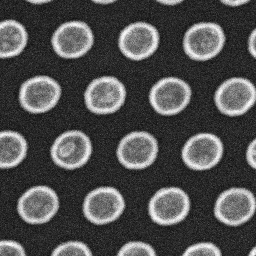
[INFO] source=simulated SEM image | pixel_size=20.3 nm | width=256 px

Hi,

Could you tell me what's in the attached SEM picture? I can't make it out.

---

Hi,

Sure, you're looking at a regular array of raised bodies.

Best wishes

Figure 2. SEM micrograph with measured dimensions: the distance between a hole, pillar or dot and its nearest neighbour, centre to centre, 1300 nm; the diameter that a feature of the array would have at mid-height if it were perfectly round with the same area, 730 nanometers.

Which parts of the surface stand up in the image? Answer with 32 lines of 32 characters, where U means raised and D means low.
DDDDDDDDDDDDDDDDDDDDDDDDDDDDDUDD
DDDDDDDDDDDDDDDDDDDDDDDDDDDDDDDD
DDDDDDDDDDDDDDDDDDDDDDDDDDDDDDDD
UUUDDDDDUUUDDDDDUUUDDDDDUUUDDDDD
UUUDDDDUUUUDDDDUUUUUDDDUUUUUDDDU
UUUDDDDUUUUDDDDUUUUUDDDUUUUUDDDU
UUDDDDDUUUUDDDDDUUUDDDDDUUUDDDDU
DDDDDDDDDDDDDDDDDDDDDDDDDDDDDDDD
DDDDDDDDDDDDDDDDDDDDDDDDDDDDDDDD
DDDDDDDDDDDDDDDDDDDDDDDDDDDDDDDD
DDDUUUUDDDDDUUUDDDDDUUUDDDDDUUUD
DDDUUUUDDDDUUUUDDDDUUUUUDDDUUUUU
DDDUUUUDDDDUUUUDDDDUUUUDDDDUUUUU
DDDUUUDDDDDUUUUDDDDUUUUDDDDDUUUD
DDDDDDDDDDDDDDDDDDDDDDDDDDDDDDDD
DDDDDDDDDDDDDDDDDDDDDDDDDDDDDDDD
DDDDDDDDDDDDDDDDDDDDDDDDDDDDDDDD
UUUDDDDUUUUDDDDUUUUDDDDDUUUDDDDD
UUUDDDDUUUUDDDDUUUUDDDDUUUUUDDDU
UUUDDDDUUUUDDDDUUUUDDDDUUUUDDDDU
UUDDDDDUUUDDDDDDUUUDDDDDUUUDDDDU
DDDDDDDDDDDDDDDDDDDDDDDDDDDDDDDD
DDDDDDDDDDDDDDDDDDDDDDDDDDDDDDDD
DDDDDDDDDDDDDDDDDDDDDDDDDDDDDDDD
DDDUUUUDDDDUUUUDDDDUUUUDDDDDUUUD
DDUUUUUDDDDUUUUDDDDUUUUDDDDUUUUU
DDDUUUUDDDDUUUUDDDDUUUUDDDDUUUUU
DDDUUUDDDDDDUUDDDDDUUUDDDDDDUUUD
DDDDDDDDDDDDDDDDDDDDDDDDDDDDDDDD
DDDDDDDDDDDDDDDDDDDDDDDDDDDDDDDD
UUDDDDDDUUDDDDDDDUDDDDDDDDDDDDDD
UUUDDDDUUUUDDDDUUUUDDDDUUUUDDDDD